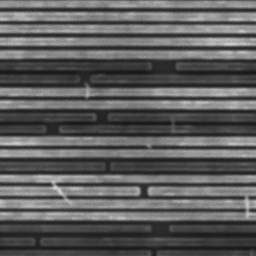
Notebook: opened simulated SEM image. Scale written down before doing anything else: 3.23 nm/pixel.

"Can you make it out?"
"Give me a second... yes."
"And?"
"parallel lines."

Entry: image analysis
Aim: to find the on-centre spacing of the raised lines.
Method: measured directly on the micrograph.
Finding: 40.4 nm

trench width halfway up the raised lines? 0.0157 micrometres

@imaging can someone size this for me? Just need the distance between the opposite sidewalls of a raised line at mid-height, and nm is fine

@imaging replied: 25.4